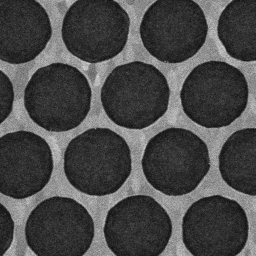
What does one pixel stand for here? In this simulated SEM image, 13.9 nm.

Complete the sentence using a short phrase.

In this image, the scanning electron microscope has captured holes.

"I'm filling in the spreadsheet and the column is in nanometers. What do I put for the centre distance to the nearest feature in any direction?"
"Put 1060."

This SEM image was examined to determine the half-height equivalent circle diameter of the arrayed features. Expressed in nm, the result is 951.